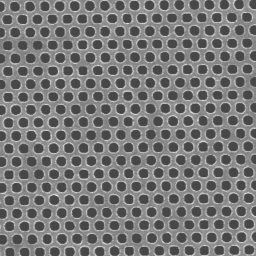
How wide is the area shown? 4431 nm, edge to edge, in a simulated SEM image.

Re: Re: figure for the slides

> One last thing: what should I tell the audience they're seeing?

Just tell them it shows a regular array of holes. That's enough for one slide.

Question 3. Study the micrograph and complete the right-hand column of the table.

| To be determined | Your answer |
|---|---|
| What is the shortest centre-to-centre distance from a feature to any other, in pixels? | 14.6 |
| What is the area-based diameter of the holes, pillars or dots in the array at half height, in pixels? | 10.1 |